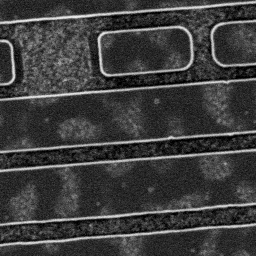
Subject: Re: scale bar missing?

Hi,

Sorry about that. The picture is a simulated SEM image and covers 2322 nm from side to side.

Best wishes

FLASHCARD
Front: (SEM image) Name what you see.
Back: one or a few lines or trenches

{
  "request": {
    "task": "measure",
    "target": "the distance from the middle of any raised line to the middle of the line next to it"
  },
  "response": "627 nm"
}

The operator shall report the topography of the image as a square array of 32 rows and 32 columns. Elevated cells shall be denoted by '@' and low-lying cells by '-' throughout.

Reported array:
@@@@@@@@@@@@@@@@@@@@@@@@@@@@@---
@@@@@@@@@@@@@@@@@---------------
@@@@----------------------------
---------------------@@----@@@@@
-------------@@@@@@@@@@@--@@@@@@
@-----------@@@@@@@@@@@@---@@@@@
@@----------@@@@@@@@@@@@---@@@@@
@@-----------@@@@@@@@@@@---@@@@@
@@-----------@@@@@@@@@@---------
@@------------------------------
@-----------------------@@@@@@@@
------------@@@@@@@@@@@@@@@@@@@@
@@@@@@@@@@@@@@@@@@@@@@@@@@@@@@@@
@@@@@@@@@@@@@@@@@@@@@@@@@@@@@@@@
@@@@@@@@@@@@@@@@@@@@@@@@@@@@@@@@
@@@@@@@@@@@@@@@@@@@@@@@@@@@@@@@@
@@@@@@@@@@@@@@@@@@@@@@@@@@@@@@@@
@@@@@@@@@@@@@@@@@@@-------------
@@@@@@@-------------------------
----------------------@@@@@@@@@@
----------@@@@@@@@@@@@@@@@@@@@@@
@@@@@@@@@@@@@@@@@@@@@@@@@@@@@@@@
@@@@@@@@@@@@@@@@@@@@@@@@@@@@@@@@
@@@@@@@@@@@@@@@@@@@@@@@@@@@@@@@@
@@@@@@@@@@@@@@@@@@@@@@@@@@@@@@@@
@@@@@@@@@@@@@@@@@@@@@@@@@@@@@@@-
@@@@@@@@@@@@@@@@@@@@------------
@@@@@@@@------------------------
--------------------------@@@@@@
--------------@@@@@@@@@@@@@@@@@@
-@@@@@@@@@@@@@@@@@@@@@@@@@@@@@@@
@@@@@@@@@@@@@@@@@@@@@@@@@@@@@@@@